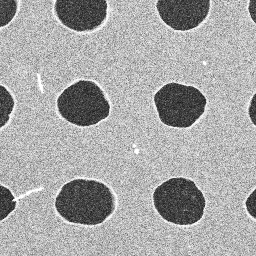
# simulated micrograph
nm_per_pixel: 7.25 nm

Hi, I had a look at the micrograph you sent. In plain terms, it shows holes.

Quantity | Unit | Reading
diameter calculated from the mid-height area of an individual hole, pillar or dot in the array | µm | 0.353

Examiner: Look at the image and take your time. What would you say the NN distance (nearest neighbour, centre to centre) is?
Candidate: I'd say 692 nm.